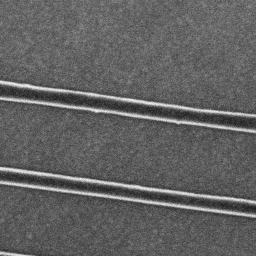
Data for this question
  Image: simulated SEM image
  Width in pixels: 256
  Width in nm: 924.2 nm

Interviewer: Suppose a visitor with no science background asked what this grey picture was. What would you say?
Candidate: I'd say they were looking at one or a few lines or trenches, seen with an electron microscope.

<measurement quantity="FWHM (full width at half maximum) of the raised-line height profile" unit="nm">55.6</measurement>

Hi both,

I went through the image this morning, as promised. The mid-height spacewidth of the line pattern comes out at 251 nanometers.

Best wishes